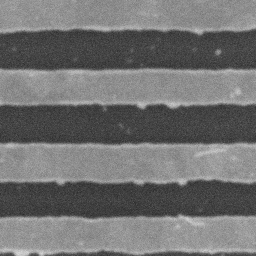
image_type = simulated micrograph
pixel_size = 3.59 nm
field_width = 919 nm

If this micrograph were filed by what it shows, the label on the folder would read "lines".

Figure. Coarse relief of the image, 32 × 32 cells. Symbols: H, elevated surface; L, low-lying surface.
HHHHHHHHHHHHHHHHHHHHHHHHHHHHHHHH
HHHHHHHHHHHHHHHHHHHHHHHHHHHHHHHH
HHHHHHHHHHHHHHHHHHHHHHHHHHHHHHHH
HHHHHHHHHHHHHHHHHHHHHHHHHHHHHHHH
LLLLLLLLLLLLLLLLLLLLLLLLLLLLLLLL
LLLLLLLLLLLLLLLLLLLLLLLLLLLLLLLL
LLLLLLLLLLLLLLLLLLLLLLLLLLLLLLLL
LLLLLLLLLLLLLLLLLLLLLLLLLLLLLLLL
LLLLLLLLLLLLLLLLLLLLLLLLLLLLLLLL
HHHHHHHHHHHHHHHHHHHHHHHHHHHHHHHH
HHHHHHHHHHHHHHHHHHHHHHHHHHHHHHHH
HHHHHHHHHHHHHHHHHHHHHHHHHHHHHHHH
HHHHHHHHHHHHHHHHHHHHHHHHHHHHHHHH
LLLLLLLLLLLLLLLLLLLLLLLLLLLLLLLL
LLLLLLLLLLLLLLLLLLLLLLLLLLLLLLLL
LLLLLLLLLLLLLLLLLLLLLLLLLLLLLLLL
LLLLLLLLLLLLLLLLLLLLLLLLLLLLLLLL
LLLLLLLLLLLLLLLLLLLLLLLLLLLLLLLL
HHHHHHHHHHHHHHHHHHHHHHHHHHHHHHHH
HHHHHHHHHHHHHHHHHHHHHHHHHHHHHHHH
HHHHHHHHHHHHHHHHHHHHHHHHHHHHHHHH
HHHHHHHHHHHHHHHHHHHHHHHHHHHHHHHH
HHHHHHHHHHHHHHHHHHHHHHHLLLLLHHHH
LLLLLLLLLLLLLLLLLLLLLLLLLLLLLLLL
LLLLLLLLLLLLLLLLLLLLLLLLLLLLLLLL
LLLLLLLLLLLLLLLLLLLLLLLLLLLLLLLL
LLLLLLLLLLLLLLLLLLLLLLLLLLLLLLLL
HHHHHHHHHHHHHHHHHHHHHHHHHHHHHHHH
HHHHHHHHHHHHHHHHHHHHHHHHHHHHHHHH
HHHHHHHHHHHHHHHHHHHHHHHHHHHHHHHH
HHHHHHHHHHHHHHHHHHHHHHHHHHHHHHHH
LHHHHHHHHHLHLLLHHHHHLLLHLHHLLLLL